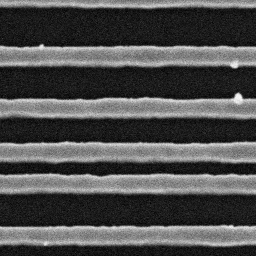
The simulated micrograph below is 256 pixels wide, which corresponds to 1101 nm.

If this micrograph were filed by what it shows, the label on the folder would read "lines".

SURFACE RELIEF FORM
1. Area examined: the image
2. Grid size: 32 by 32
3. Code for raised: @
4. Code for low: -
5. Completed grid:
@@@@@@@@@@@@@@@@@@@@@@@@@@@@@@@@
--------------------------------
--------------------------------
--------------------------------
--------------------------------
--------------------------------
@@@@@@@@@@@@@@@@@@@@@@@@@@@@@@@@
@@@@@@@@@@@@@@@@@@@@@@@@@@@@@@@@
--------------------------------
--------------------------------
--------------------------------
--------------------------------
@@@@@@@@-@@-@@@@@@@@@@--@@@@@@@@
@@@@@@@@@@@@@@@@@@@@@@@@@@@@@@@@
@---@@@@@@@@@@@@@@@@@@@@@@@@@@@@
--------------------------------
--------------------------------
--------------------------------
@@@@@@@@@@@@@@@@@@@@@@@@@@@@@@@@
@@@@@@@@@@@@@@@@@@@@@@@@@@@@@@@@
--------------------------------
--------------------------------
@@@@@@@@@@@@@@@@@@@@@@@@@@@@@@@@
@@@@@@@@@@@@@@@@@@@@@@@@@@@@@@@@
--------------------------------
--------------------------------
--------------------------------
--------------------------------
@@@@@@@@@@@@@@@@@@@@@@@@@@@@@@@@
@@@@@@@@@@@@@@@@@@@@@@@@@@@@@@@@
@---@@@@@@@@@@@@-@-----@@@@@@@@-
--------------------------------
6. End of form